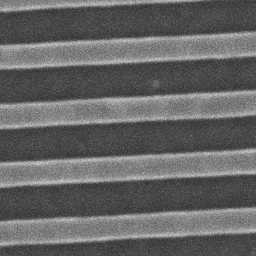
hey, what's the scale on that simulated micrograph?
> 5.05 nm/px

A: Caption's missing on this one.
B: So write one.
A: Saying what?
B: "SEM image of parallel lines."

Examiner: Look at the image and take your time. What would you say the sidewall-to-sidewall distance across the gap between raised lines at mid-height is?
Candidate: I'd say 181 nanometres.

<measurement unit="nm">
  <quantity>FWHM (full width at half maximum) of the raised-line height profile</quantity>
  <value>114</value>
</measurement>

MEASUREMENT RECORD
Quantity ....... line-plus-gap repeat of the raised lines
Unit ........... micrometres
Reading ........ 0.296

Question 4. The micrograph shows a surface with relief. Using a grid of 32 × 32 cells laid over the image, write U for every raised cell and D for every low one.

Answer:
UUUUUUUUUUUUUUUUDDDDDDDDDDDDDDDD
DDDDDDDDDDDDDDDDDDDDDDDDDDDDDDDD
DDDDDDDDDDDDDDDDDDDDDDDDDDDDDDDD
DDDDDDDDDDDDDDDDDDDDDDDDDDDDDDDD
DDDDDDDDDDDDDDDDDDDDDDDDDDUUUUUU
DDDDDDUUUUUUUUUUUUUUUUUUUUUUUUUU
UUUUUUUUUUUUUUUUUUUUUUUUUUUUUUUU
UUUUUUUUUUUUUUUUUUUDUDDDDDDDDDDD
DDDDDDDDDDDDDDDDDDDDDDDDDDDDDDDD
DDDDDDDDDDDDDDDDDDDDDDDDDDDDDDDD
DDDDDDDDDDDDDDDDDDDDDDDDDDDDDDDD
DDDDDDDDDDDDDDDDDDDDDDDDDDDDDDDU
DDDDDDDDDDDUUUUUUUUUUUUUUUUUUUUU
UUUUUUUUUUUUUUUUUUUUUUUUUUUUUUUU
UUUUUUUUUUUUUUUUUUUUUUUUUUUUUDDD
UUUUUUUUDDDDDDDDDDDDDDDDDDDDDDDD
DDDDDDDDDDDDDDDDDDDDDDDDDDDDDDDD
DDDDDDDDDDDDDDDDDDDDDDDDDDDDDDDD
DDDDDDDDDDDDDDDDDDDDDDDDDDDDDDDD
DDDDDDDDDDDDDDDDDDDUUUUUUUUUUUUU
UUUUUUUUUUUUUUUUUUUUUUUUUUUUUUUU
UUUUUUUUUUUUUUUUUUUUUUUUUUUUUUUU
UUUUUUUUUUUUUUUDDDDDDDDDDDDDDDDD
DDDDDDDDDDDDDDDDDDDDDDDDDDDDDDDD
DDDDDDDDDDDDDDDDDDDDDDDDDDDDDDDD
DDDDDDDDDDDDDDDDDDDDDDDDDDDDDDDD
DDDDDDDDDDDDDDDDDDDDDDDDUUUUUUUU
DDDDDDUUUUUUUUUUUUUUUUUUUUUUUUUU
UUUUUUUUUUUUUUUUUUUUUUUUUUUUUUUU
UUUUUUUUUUUUUUUUUUUUDDDDDDDDDDDD
UDDDDDDDDDDDDDDDDDDDDDDDDDDDDDDD
DDDDDDDDDDDDDDDDDDDDDDDDDDDDDDDD